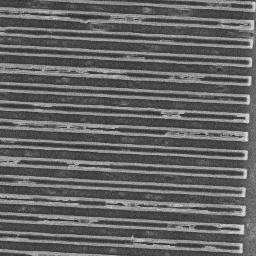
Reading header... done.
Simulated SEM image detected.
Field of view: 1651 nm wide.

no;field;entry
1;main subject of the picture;parallel lines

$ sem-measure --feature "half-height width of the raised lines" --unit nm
48.3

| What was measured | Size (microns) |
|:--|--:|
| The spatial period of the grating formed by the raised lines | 0.12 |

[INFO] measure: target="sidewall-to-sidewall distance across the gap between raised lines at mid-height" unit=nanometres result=75.7